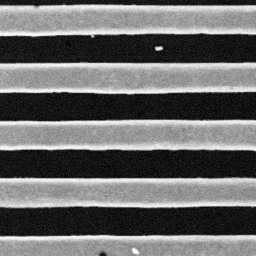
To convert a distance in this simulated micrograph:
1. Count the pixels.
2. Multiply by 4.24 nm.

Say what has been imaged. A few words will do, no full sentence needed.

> lines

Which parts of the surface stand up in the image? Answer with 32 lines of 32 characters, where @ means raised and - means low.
--------------------------------
@@@@@@@@@@@@@@@@@@@@@@@@@@@@@@@@
@@@@@@@@@@@@@@@@@@@@@@@@@@@@@@@@
@@@@@@@@@@@@@@@@@@@@@@@@@@@@@@@@
--------------------------------
--------------------------------
--------------------------------
--------------------------------
@@@@@@@@@@@@@@@@@@@@@@@@@@@@@@@@
@@@@@@@@@@@@@@@@@@@@@@@@@@@@@@@@
@@@@@@@@@@@@@@@@@@@@@@@@@@@@@@@@
------------@@@@@@@@------------
--------------------------------
--------------------------------
--------------------------------
@@@@@@@@@@@@@@@@@@@@@@@@@@@@@@@@
@@@@@@@@@@@@@@@@@@@@@@@@@@@@@@@@
@@@@@@@@@@@@@@@@@@@@@@@@@@@@@@@@
@@@@@@@@@@@@@@@@@@@--@----@@@@@@
--------------------------------
--------------------------------
--------------------------------
@@@@@@@@@@-@@@@@@@@@-@@---------
@@@@@@@@@@@@@@@@@@@@@@@@@@@@@@@@
@@@@@@@@@@@@@@@@@@@@@@@@@@@@@@@@
@@@@@@@@@@@@@@@@@@@@@@@@@@@@@@@@
--------------------------------
--------------------------------
--------------------------------
--------------------------------
@@@@@@@@@@@@@@@@@@@@@@@@@@@@@@@@
@@@@@@@@@@@@@@@@@@@@@@@@@@@@@@@@